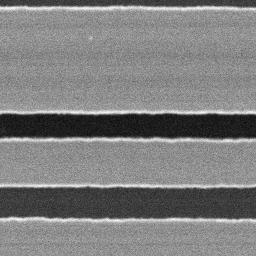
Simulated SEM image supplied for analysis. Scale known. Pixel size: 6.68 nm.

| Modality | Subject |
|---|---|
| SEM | lines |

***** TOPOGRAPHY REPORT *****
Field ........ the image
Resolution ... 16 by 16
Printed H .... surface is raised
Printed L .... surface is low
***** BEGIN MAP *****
HHHHHHHHHHHLHHHL
HHHHHHHHHHHHHHHH
HHHHHHHHHHHHHHHH
HHHHHHHHHHHHHHHH
HHHHHHHHHHHHHHHH
HHHHHHHHHHHHHHHH
HHHHHHHHHHHHHHHH
LLLLLLLLLLLLLLLL
LLLLLLLLLLLLLLLL
HHHHHHHHHHHHHHHH
HHHHHHHHHHHHHHHH
HHHHHHHHHHHHHHHH
LLLLLLLLLLLLLLLL
LLLLLLLLLLLLLLLL
HHHHHHHHHHHHHHHH
HHHHHHHHHHHHHHHH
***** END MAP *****